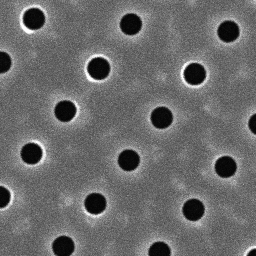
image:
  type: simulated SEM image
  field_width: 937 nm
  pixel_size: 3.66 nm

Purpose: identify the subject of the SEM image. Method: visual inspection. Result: a regular array of holes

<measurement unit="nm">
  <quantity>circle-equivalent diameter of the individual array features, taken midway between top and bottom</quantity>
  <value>82.3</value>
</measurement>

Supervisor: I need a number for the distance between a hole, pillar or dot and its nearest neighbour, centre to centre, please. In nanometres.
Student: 198